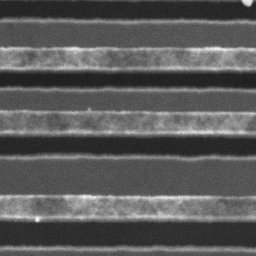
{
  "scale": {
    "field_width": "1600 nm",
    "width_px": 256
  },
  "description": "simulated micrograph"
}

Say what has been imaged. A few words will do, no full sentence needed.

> lines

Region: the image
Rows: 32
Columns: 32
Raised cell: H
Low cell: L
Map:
LLLLLLLLLLLLLLLLLLLLLLLLLLLLLLLL
LLLLLLLLLLLLLLLLLLLLLLLLLLLLLLLL
HHHHHLHHLLLLLLLLLLLLLLLLLLLLLLLL
HHHHHHHHHHHHHHHHHHHHHHHHHHHHHHHH
HHHHHHHHHHHHHHHHHHHHHHHHHHHHHHHH
HHHHHHHHHHHHHHHHHHHHHHHHHHHHHHHH
HHHHHHHHHHHHHHHHHHHHHHHHHHHHHHHH
HHHHHHHHHHHHHHHHHHHHHHHHHHHHHHHH
HHHHHHHHHHHHHHHHHHHHHHHHHHHHHHHH
LLLLLLLLLLLLLLLLLLLLLLLLLLLLLLLL
LLLLLLLLLLLLLLLLLLLLLLLLLLLLLLLL
HHHHHHHHHHHHHHHHHHHHHHHHHHHHHHHH
HHHHHHHHHHHHHHHHHHHHHHHHHHHHHHHH
HHHHHHHHHHHHHHHHHHHHHHHHHHHHHHHH
HHHHHHHHHHHHHHHHHHHHHHHHHHHHHHHH
HHHHHHHHHHHHHHHHHHHHHHHHHHHHHHHH
HHHHHHHHHHHHHHHHHHHHHHHHHHHHHHHH
LLLLLLLLLLLLLLLLLLLLLLLLLLLLLLLL
LLLLLLLLLLLLLLLLLLLLLLLLLLLLLLLL
LLLLLHHHLHLLLLLLLLLLLLLLLLLLLLLL
HHHHHHHHHHHHHHHHHHHHHHHHHHHHHHHH
HHHHHHHHHHHHHHHHHHHHHHHHHHHHHHHH
HHHHHHHHHHHHHHHHHHHHHHHHHHHHHHHH
HHHHHHHHHHHHHHHHHHHHHHHHHHHHHHHH
HHHHHHHHHHHHHHHHHHHHHHHHHHHHHHHH
HHHHHHHHHHHHHHHHHHHHHHHHHHHHHHHH
HHHHHHHHHHHHHHHHHHHHHHHHHHHHHHHH
LLLLHLLLLLLLLLLLLLLLLLLLLLLLLLLL
LLLLLLLLLLLLLLLLLLLLLLLLLLLLLLLL
LLLLLLLLLLLLLLLLLLLLLLLLLLLLLLLL
LLLLLLLLLLLLLLLLLLLLLLLLLLLLLLLL
HHHHHHHHHHHHHHHHHHHHHHHHHHHHHHHH